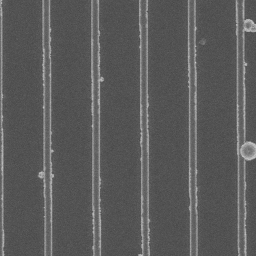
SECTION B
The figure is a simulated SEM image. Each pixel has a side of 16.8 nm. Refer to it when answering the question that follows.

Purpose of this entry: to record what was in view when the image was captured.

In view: lines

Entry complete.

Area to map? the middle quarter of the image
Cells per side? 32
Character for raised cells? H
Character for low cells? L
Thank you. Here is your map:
LLLLLLLHHLLLLLLLLLLHHLLLLLLLLLLH
LLLLLLLHHLLLLLLLLLLHHLLLLLLLLLLH
LLLLLLLHHLLLLLLLLLLHHLLLLLLLLLLH
LLLLLLLHHLLLLLLLLLLHHLLLLLLLLLLH
LLLLLLLHHLLLLLLLLLLHHLLLLLLLLLLH
LLLLLLLHHLLLLLLLLLLHHLLLLLLLLLLH
LLLLLLLHHLLLLLLLLLLHHLLLLLLLLLLH
LLLLLLLHHLLLLLLLLLLHHLLLLLLLLLLH
LLLLLLLHHLLLLLLLLLLHHLLLLLLLLLLH
LLLLLLLHHLLLLLLLLLLHHLLLLLLLLLLH
LLLLLLLHHLLLLLLLLLLHHLLLLLLLLLLH
LLLLLLLHHLLLLLLLLLLHHLLLLLLLLLLH
LLLLLLLHHLLLLLLLLLLHHLLLLLLLLLLH
LLLLLLLHHLLLLLLLLLLHHLLLLLLLLLLH
LLLLLLLHHLLLLLLLLLLHHLLLLLLLLLLH
LLLLLLLHHLLLLLLLLLLHHLLLLLLLLLLH
LLLLLLLHHLLLLLLLLLLHHLLLLLLLLLLH
LLLLLLLHHLLLLLLLLLLHHLLLLLLLLLLH
LLLLLLLHHLLLLLLLLLLHHLLLLLLLLLLH
LLLLLLLHHLLLLLLLLLLHHLLLLLLLLLLH
LLLLLLLHHLLLLLLLLLLHHLLLLLLLLLLH
LLLLLLLHHLLLLLLLLLLHHLLLLLLLLLLH
LLLLLLLHHLLLLLLLLLLHHLLLLLLLLLLH
LLLLLLLHHLLLLLLLLLLHHLLLLLLLLLLH
LLLLLLLHHLLLLLLLLLLHHLLLLLLLLLLH
LLLLLLLHHLLLLLLLLLLHHLLLLLLLLLLH
LLLLLLLHHLLLLLLLLLLHHLLLLLLLLLLH
LLLLLLLHHLLLLLLLLLLHHLLLLLLLLLLH
LLLLLLLHHLLLLLLLLLLHHLLLLLLLLLLH
LLLLLLLHHLLLLLLLLLLHHLLLLLLLLLLH
LLLLLLLHHLLLLLLLLLLHHLLLLLLLLLLH
LLLLLLLHHLLLLLLLLLLHHLLLLLLLLLLH